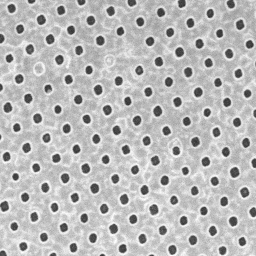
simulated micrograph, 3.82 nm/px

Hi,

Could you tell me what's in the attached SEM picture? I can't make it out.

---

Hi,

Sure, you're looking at a regular array of holes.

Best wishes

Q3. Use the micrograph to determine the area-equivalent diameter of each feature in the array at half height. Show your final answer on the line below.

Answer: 37.9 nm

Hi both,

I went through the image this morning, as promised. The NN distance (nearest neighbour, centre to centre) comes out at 83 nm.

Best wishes